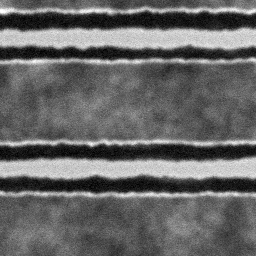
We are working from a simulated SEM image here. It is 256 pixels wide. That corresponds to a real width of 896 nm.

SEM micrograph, lines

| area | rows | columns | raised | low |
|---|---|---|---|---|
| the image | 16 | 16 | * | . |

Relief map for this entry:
****************
................
................
................
****************
****************
****************
****************
****************
................
................
................
****************
****************
****************
****************